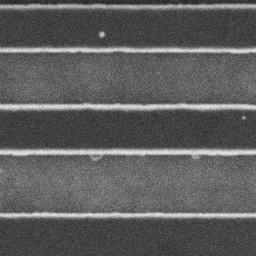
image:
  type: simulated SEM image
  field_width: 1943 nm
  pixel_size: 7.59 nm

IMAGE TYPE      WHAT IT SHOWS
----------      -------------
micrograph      lines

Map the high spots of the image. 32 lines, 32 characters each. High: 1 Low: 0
00000000000000000000000000000000
11111111111111111111111111111111
11111111111111111111111111111111
11111111111111111111111111111111
11111111111111111111111111111111
11111111111111111111111111111111
00000000000000000000000000000110
00000000000000000000000000000000
00000000000000000000000000000000
00000000000000000000000000000000
00000000000000000000000000000000
00000000000000000000000000000000
00000000000000000000000000000000
11111111111111111111111111111111
11111111111111111111111111111111
11111111111111111111111111111111
11111111111111111111111111111111
11111111111111111111111111111111
11111111111111111111111111111111
00000000000000000000000000000000
00000000000000000000000000000000
00000000000000000000000000000000
00000000000000000000000000000000
00000000000000000000000000000000
00000000000000000000000000000000
00000000000000000000000000000000
00000000000000000000000000000000
11111111111111111111111111111111
11111111111111111111111111111111
11111111111111111111111111111111
11111111111111111111111111111111
11111111111111111111111111111111